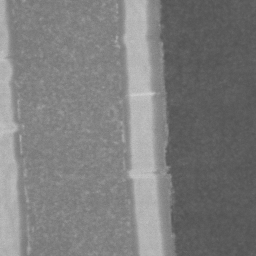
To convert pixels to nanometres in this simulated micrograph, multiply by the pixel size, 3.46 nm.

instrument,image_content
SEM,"one or a few lines or trenches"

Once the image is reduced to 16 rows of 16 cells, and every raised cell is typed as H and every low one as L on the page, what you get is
HHHHHHHHHLLLLLLL
HHHHHHHHHLLLLLLL
HHHHHHHHHLLLLLLL
HHHHHHHHHLLLLLLL
HHHHHHHHHLLLLLLL
HHHHHHHHHLLLLLLL
HHHHHHHHHLLLLLLL
HHHHHHHHHLLLLLLL
HHHHHHHHHLLLLLLL
HHHHHHHHHLLLLLLL
HHHHHHHHHLLLLLLL
HHHHHHHHHLLLLLLL
HHHHHHHHHLLLLLLL
HHHHHHHHHLLLLLLL
HHHHHHHHHLLLLLLL
HHHHHHHHHLLLLLLL